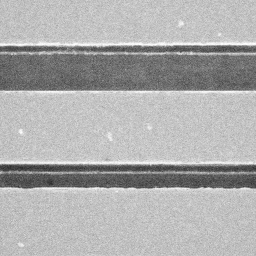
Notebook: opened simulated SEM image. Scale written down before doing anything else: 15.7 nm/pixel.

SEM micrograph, lines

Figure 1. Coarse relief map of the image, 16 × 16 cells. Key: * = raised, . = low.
****************
****************
****************
................
................
................
****************
****************
****************
****************
................
................
****************
****************
****************
****************